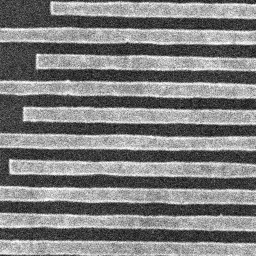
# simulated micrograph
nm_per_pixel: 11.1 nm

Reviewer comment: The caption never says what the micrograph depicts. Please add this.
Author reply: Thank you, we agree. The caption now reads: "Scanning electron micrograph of parallel lines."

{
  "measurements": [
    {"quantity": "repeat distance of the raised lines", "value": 295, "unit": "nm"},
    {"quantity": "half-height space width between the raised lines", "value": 154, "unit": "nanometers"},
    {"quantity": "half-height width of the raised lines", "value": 144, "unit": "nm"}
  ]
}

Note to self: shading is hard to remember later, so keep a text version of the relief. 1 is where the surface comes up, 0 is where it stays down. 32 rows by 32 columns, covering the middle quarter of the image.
11111111111111111111111111111111
00000000000000000000000000000000
00000000000000000000000000000000
00000000000000000000000000000000
11000000000000000000000000000000
11111111111111111111111111111111
11111111111111111111111111111111
11111111111111111111111111111111
00000000000000000000000000000000
00000000000000000000000000000000
00000000000000000000000000000000
11111111111111111111101110000000
11111111111111111111111111111111
11111111111111111111111111111111
00000000000011111111111111111111
00000000000000000000000000000000
00000000000000000000000000000000
00000000000000000000000000000000
11111111111111111111111110000000
11111111111111111111111111111111
11111111111111111111111111111111
00000000000000000000000000000000
00000000000000000000000000000000
00000000000000000000000000000000
10000000000000000000000000000000
11111111111111111111111111111111
11111111111111111111111111111111
11111000000001111111111111111111
00000000000000000000000000000000
00000000000000000000000000000000
00000000000000000000000000000000
11111111111111111111100001110011